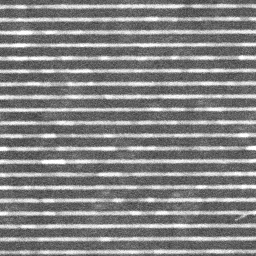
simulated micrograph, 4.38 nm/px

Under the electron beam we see parallel lines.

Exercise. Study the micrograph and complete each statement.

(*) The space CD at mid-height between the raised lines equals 42.7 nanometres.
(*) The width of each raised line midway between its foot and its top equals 14.2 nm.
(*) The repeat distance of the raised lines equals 56.6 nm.